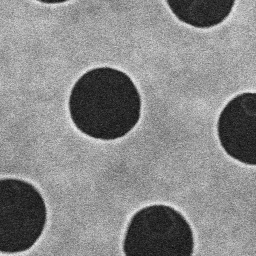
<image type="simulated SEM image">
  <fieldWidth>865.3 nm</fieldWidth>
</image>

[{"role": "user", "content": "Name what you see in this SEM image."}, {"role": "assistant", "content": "holes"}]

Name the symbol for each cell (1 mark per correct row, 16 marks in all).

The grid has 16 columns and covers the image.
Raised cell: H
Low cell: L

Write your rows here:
HHHHHHHHHHHLLLHH
HHHHHHHHHHHHLLHH
HHHHHHHHHHHHHHHH
HHHHHHHHHHHHHHHH
HHHHHLLLHHHHHHHH
HHHHHLLLHHHHHHHH
HHHHLLLLLHHHHHLL
HHHHHLLLLHHHHHLL
HHHHHHLLHHHHHHLL
HHHHHHHHHHHHHHLL
HHHHHHHHHHHHHHHH
LLHHHHHHHHHHHHHH
LLLHHHHHHHHHHHHH
LLLHHHHHLLLHHHHH
LLLHHHHHLLLLHHHH
LLHHHHHHLLLLHHHH